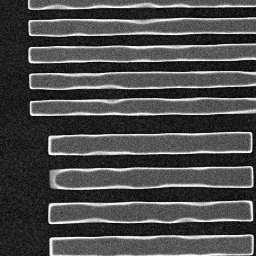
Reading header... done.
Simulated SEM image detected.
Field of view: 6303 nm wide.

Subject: groups of lines, slits or small figures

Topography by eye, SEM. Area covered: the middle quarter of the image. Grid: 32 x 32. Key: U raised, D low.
DDDDDDDDDDDDDDDDDDDDDDDDDDDDDDDD
DDDDDDDDDDDDDDDDDDDDDDDDDDDDDDDD
DDDDDDDDDUUUUUUUUUUUUUUUUUUUUUUU
UUUUUUUUUUUUUUUUUUUUUUUUUUUUUUUU
UUUUUUUUUUUUUUUUUUUUUUUUUUUUUUUU
UUUUUUUUUUUUUUUUUUUUUUUUUUUUUUUU
DDDDDDDDDDDDDDDDDDDDDDDDDDDDDDDD
DDDDDDDDDDDDDDDDDDDDDDDDDDDDDDDD
DDDDDDDDDDDDDDDDDDDDDDDDDDDDDDDD
UUUUUUUUUUUUUUUUUUUUUUUUUUUUUUUU
UUUUUUUUUUUUUUUUUUUUUUUUUUUUUUUU
UUUUUUUUUUUUUUUUUUUUUUUUUUUUUUUU
UUDDDDUUUUUDDDUUUUDDDUUUUDDDDDDU
DDDDDDDDDDDDDDDDDDDDDDDDDDDDDDDD
DDDDDDDDDDDDDDDDDDDDDDDDDDDDDDDD
DDDDDDDDDDDDDDDDDDDDDDDDDDDDDDDD
DDDDDDDDDDDDDDDDDDDDDDDDDDDDDDDD
DDDDDDDDDDDDDDDDDDDDDDDDDDDDDDDD
UUUUUUUUUUUUUUUUUUUUUUUUUUUUUUUU
UUUUUUUUUUUUUUUUUUUUUUUUUUUUUUUU
UUUUUUUUUUUUUUUUUUUUUUUUUUUUUUUU
UUUUUUUUUUUUUUUUUUUUUUUUUUUUUUUU
UUUUUUDDDDDDDDDDDDDDDDDDDDDDDDDD
DDDDDDDDDDDDDDDDDDDDDDDDDDDDDDDD
DDDDDDDDDDDDDDDDDDDDDDDDDDDDDDDD
DDDDDDDDDDDDDDDDDDDDDDDDDDDDDDDD
UUUUUDDUUUUUUUUUUUUUUUUUUUUUUUUU
UUUUUUUUUUUUUUUUUUUUUUUUUUUUUUUU
UUUUUUUUUUUUUUUUUUUUUUUUUUUUUUUU
UUUUUUUUUUUUUUUUUUUUUUUUUUUUUUUU
UUUUUUUUUUUUUUUUUUUUUUUUUDDDDDDD
DDDDDDDDDDDDDDDDDDDDDDDDDDDDDDDD